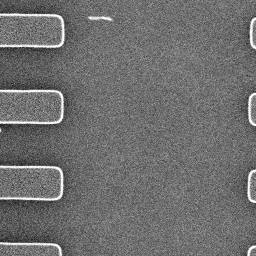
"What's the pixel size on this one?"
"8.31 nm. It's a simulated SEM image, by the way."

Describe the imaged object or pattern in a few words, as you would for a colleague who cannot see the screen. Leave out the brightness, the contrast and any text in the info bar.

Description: groups of lines, slits or small figures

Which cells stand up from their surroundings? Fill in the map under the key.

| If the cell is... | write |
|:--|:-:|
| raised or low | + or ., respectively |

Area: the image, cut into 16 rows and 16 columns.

................
++++............
++++............
................
................
................
++++............
++++............
................
................
+++.............
++++............
................
................
................
++++............